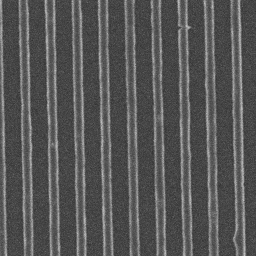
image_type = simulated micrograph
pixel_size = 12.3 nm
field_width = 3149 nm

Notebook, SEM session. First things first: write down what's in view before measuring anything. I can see parallel lines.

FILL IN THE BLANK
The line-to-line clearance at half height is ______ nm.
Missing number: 218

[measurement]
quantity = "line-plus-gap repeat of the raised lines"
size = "326 nm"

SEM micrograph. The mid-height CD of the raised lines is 109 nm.